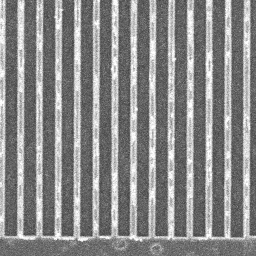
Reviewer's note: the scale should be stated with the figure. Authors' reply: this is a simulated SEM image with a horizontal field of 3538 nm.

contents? parallel lines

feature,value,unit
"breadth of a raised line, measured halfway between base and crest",0.0657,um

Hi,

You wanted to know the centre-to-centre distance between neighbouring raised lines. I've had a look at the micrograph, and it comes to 0.26 um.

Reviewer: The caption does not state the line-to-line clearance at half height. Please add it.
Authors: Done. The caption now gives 0.185 µm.